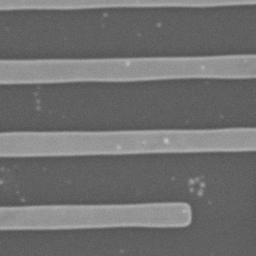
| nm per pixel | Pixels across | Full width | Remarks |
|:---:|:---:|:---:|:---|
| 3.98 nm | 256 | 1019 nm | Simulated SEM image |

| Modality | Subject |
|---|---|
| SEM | groups of lines, slits or small figures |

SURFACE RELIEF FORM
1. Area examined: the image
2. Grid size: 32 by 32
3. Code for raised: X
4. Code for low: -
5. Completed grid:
XXXXXXXXXXXXXXXXXXXXXXXXXXXXXX--
--------------------------------
--------------------------------
--------------------------------
--------------------------------
--------------------------------
--------------------------------
-------------XXXXXXXXXXXXXXXXXXX
XXXXXXXXXXXXXXXXXXXXXXXXXXXXXXXX
XXXXXXXXXXXXXXXXXXXXXXXXXXXXXXXX
--------------------------------
--------------------------------
--------------------------------
--------------------------------
--------------------------------
--------------------------------
---------------XXXXXXXXXXXXXXXXX
XXXXXXXXXXXXXXXXXXXXXXXXXXXXXXXX
XXXXXXXXXXXXXXXXXXXXXXXXXXXXXXXX
--------------------------------
--------------------------------
--------------------------------
--------------------------------
--------------------------------
--------------------------------
--------------------------------
XXXXXXXXXXXXXXXXXXXXXXXX--------
XXXXXXXXXXXXXXXXXXXXXXXX--------
XXXXXXXX------------------------
--------------------------------
--------------------------------
--------------------------------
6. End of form